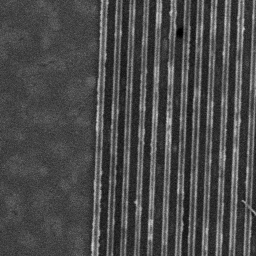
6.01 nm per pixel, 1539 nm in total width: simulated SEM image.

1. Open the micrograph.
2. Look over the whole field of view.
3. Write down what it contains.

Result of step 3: parallel lines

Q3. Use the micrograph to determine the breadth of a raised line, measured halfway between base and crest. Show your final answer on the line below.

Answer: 32.3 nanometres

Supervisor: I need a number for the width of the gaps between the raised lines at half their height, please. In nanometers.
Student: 53.3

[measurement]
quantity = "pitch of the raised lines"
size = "82.6 nm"